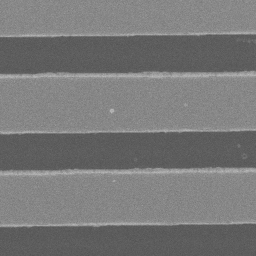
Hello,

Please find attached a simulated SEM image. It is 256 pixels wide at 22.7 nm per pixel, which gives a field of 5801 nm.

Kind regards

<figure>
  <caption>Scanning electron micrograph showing lines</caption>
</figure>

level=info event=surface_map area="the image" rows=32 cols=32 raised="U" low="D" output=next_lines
UUUUUUUUUUUUUUUUUUUUUUUUUUUUUUUU
UUUUUUUUUUUUUUUUUUUUUUUUUUUUUUUU
UUUUUUUUUUUUUUUUUUUUUUUUUUUUUUUU
UUUUUUUUUUUUUUUUUUUUUUUUUUUUUUUU
UUUUUUUDDDDDDDDDDDDDDDDDDDDDDDDD
DDDDDDDDDDDDDDDDDDDDDDDDDDDDDDDD
DDDDDDDDDDDDDDDDDDDDDDDDDDDDDDDD
DDDDDDDDDDDDDDDDDDDDDDDDDDDDDDDD
DDDDDDDDDDDDDDDDDDDDDDDDDDDDDDDD
UUUUUUUUUUUUUUUUUUUUUUUUUUUUUUUU
UUUUUUUUUUUUUUUUUUUUUUUUUUUUUUUU
UUUUUUUUUUUUUUUUUUUUUUUUUUUUUUUU
UUUUUUUUUUUUUUUUUUUUUUUUUUUUUUUU
UUUUUUUUUUUUUUUUUUUUUUUUUUUUUUUU
UUUUUUUUUUUUUUUUUUUUUUUUUUUUUUUU
UUUUUUUUUUUUUUUUUUUUUUUUUUUUUUUU
UUUUUUUUUUUUDDDDDDDDDDDDDDDDDDDD
DDDDDDDDDDDDDDDDDDDDDDDDDDDDDDDD
DDDDDDDDDDDDDDDDDDDDDDDDDDDDDDDD
DDDDDDDDDDDDDDDDDDDDDDDDDDDDDDDD
DDDDDDDDDDDDDDDDDDDDDDDDDDDDDDDD
DDDDDUUUUUUUUUUUUUUUUUUUUUUUUUUU
UUUUUUUUUUUUUUUUUUUUUUUUUUUUUUUU
UUUUUUUUUUUUUUUUUUUUUUUUUUUUUUUU
UUUUUUUUUUUUUUUUUUUUUUUUUUUUUUUU
UUUUUUUUUUUUUUUUUUUUUUUUUUUUUUUU
UUUUUUUUUUUUUUUUUUUUUUUUUUUUUUUU
UUUUUUUUUUUUUUUUUUUUUUUUUUUUUUUU
DDDDDDDDDDDDDDDDDDDDDDDDDDDDDDDD
DDDDDDDDDDDDDDDDDDDDDDDDDDDDDDDD
DDDDDDDDDDDDDDDDDDDDDDDDDDDDDDDD
DDDDDDDDDDDDDDDDDDDDDDDDDDDDDDDD